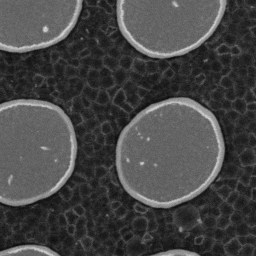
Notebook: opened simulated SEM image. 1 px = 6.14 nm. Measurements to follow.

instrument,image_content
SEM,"raised bodies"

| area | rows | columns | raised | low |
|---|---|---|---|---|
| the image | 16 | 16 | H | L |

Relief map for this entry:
HHHHHLLHHHHHHHLL
HHHHHLLLHHHHHHLL
HHHHLLLLHHHHHLLL
LLLLLLLLLLHLLLLL
LLLLLLLLLLLLLLLL
LLLLLLLLLLLLLLLL
LHHLLLLLLLHHLLLL
HHHHLLLLHHHHHLLL
HHHHHLLLHHHHHHLL
HHHHHLLHHHHHHHLL
HHHHLLLHHHHHHHLL
HHHHLLLLHHHHHLLL
HHLLLLLLLHHHLLLL
LLLLLLLLLLLLLLLL
LLLLLLLLLLLLLLLL
LHHLLLLLLLLLLLLL